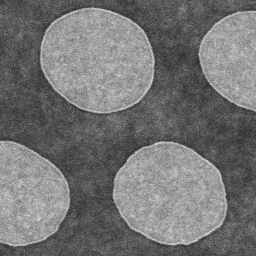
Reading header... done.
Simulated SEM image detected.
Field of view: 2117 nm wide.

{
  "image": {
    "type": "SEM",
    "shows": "raised bodies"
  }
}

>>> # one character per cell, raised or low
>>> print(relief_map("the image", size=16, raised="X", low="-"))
----------------
---XXXXX------XX
---XXXXXX----XXX
---XXXXXXX--XXXX
---XXXXXXX---XXX
---XXXXXX----XXX
-----XXX-------X
----------------
----------------
XX-------XXX----
XXX-----XXXXX---
XXXX---XXXXXXX--
XXXX---XXXXXXX--
XXXX----XXXXXX--
XXX------XXXX---
----------------